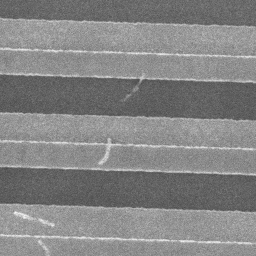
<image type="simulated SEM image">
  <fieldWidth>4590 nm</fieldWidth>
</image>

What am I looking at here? lines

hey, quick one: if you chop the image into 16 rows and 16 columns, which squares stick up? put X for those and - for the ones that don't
----------------
XXXXXXXXXX------
XXXXXXXXXXXXXXXX
XXXXXXXXXXXXXXXX
XXXXXXXXXXXXXXXX
----------------
----------------
XXXXXXXXXXXXXX--
XXXXXXXXXXXXXXXX
XXXXXXXXXXXXXXXX
---XXXXXXXXXXXXX
----------------
----------------
XXXXXXXXXXXXXXXX
XXXXXXXXXXXXXXXX
XXXXXXXXXXXXXXXX